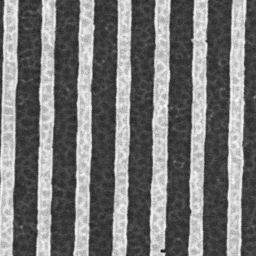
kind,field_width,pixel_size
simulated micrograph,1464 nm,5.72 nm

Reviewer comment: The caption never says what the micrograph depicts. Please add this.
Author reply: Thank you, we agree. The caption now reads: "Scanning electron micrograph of parallel lines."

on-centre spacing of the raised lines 217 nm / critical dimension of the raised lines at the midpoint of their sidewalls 70.7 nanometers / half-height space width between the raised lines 25.5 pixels